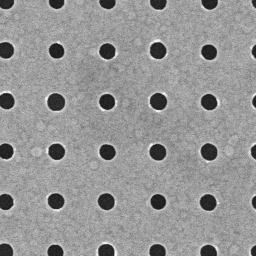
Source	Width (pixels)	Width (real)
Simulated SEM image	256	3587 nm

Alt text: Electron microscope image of a regular array of holes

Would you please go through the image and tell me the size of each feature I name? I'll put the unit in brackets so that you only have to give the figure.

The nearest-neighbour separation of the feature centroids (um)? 0.7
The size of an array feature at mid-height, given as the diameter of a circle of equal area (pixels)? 16.6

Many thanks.